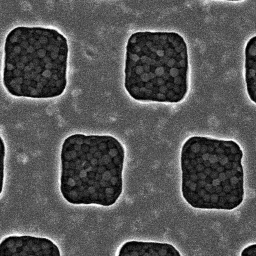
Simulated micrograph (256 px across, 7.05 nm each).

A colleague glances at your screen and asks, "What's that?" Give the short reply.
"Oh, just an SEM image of holes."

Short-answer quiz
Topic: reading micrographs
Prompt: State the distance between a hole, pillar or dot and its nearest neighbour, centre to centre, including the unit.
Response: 848 nm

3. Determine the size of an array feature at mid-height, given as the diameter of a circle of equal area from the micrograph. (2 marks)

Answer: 509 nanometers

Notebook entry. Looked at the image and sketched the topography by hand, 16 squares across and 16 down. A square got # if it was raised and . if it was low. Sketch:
################
################
....####...#####
....####....###.
....####....###.
....####....###.
################
################
####...#########
####....###....#
####....###....#
####....###....#
####...#####...#
################
################
....####...####.